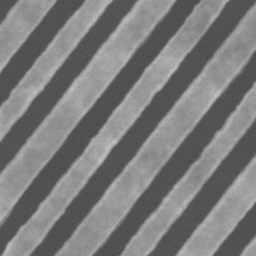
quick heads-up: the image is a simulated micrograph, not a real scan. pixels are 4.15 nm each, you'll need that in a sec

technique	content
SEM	lines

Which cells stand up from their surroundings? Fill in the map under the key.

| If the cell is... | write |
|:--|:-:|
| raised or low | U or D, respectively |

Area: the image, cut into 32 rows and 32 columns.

DDUUUUUDDDUUUUDDDUUUUUDDDUUUDDDD
DUUUUUDDDUUUUDDDUUUUUDDDUUUUDDDU
DUUUUDDDDUUUDDDUUUUUDDDUUUUDDDUU
UUUUDDDDUUUDDDDUUUUDDDDUUUDDDUUU
UUUUDDDUUUUDDDUUUUDDDDUUUDDDDUUU
UUUDDDUUUUDDDUUUUUDDDUUUUDDDUUUU
UUDDDUUUUDDDUUUUUDDDUUUUDDDUUUUU
UDDDDUUUDDDUUUUUDDDUUUUDDDUUUUUD
DDDDUUUDDDDUUUUDDDUUUUDDDUUUUUDD
DDDUUUUDDDUUUUUDDDUUUDDDDUUUUDDD
DDUUUUDDDUUUUUDDDUUUUDDDUUUUUDDD
DUUUUDDDUUUUUDDDUUUUDDDUUUUUDDDU
DUUUDDDUUUUUDDDUUUUDDDUUUUUDDDUU
UUUDDDDUUUUDDDDUUUDDDUUUUUDDDDUU
UUUDDDUUUUDDDDUUUDDDDUUUUDDDDUUU
UUDDDUUUUUDDDUUUUDDDUUUUUDDDUUUU
UDDDUUUUUDDDUUUUDDDUUUUUDDDUUUUD
DDDUUUUUDDDUUUUDDDUUUUUDDDUUUUDD
DDDUUUUDDDDUUUDDDDUUUUDDDDUUUDDD
DDUUUUUDDDUUUDDDDUUUUDDDDUUUDDDD
DUUUUUDDDUUUUDDDUUUUUDDDUUUDDDDU
UUUUUDDDUUUUDDDUUUUUDDDUUUUDDDUU
UUUUDDDUUUUDDDUUUUUDDDUUUUDDDUUU
UUUDDDDUUUDDDDUUUUDDDDUUUDDDDUUU
UUUDDDUUUDDDDUUUUDDDDUUUDDDDUUUU
UUDDDUUUUDDDUUUUUDDDUUUUDDDUUUUU
UDDDUUUUDDDUUUUUDDDUUUUDDDUUUUUD
DDDDUUUDDDUUUUUDDDUUUUDDDUUUUUDD
DDDUUUDDDDUUUUDDDUUUUDDDDUUUUDDD
DDUUUUDDDUUUUUDDDUUUDDDDUUUUDDDD
DUUUUDDDUUUUUDDDUUUUDDDUUUUUDDDU
UUUUDDDUUUUUDDDUUUUDDDUUUUUDDDUU